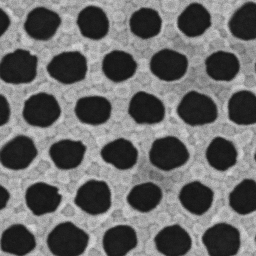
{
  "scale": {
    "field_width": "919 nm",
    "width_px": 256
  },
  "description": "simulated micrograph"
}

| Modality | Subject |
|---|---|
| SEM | a regular array of holes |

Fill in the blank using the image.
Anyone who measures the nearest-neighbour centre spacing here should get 179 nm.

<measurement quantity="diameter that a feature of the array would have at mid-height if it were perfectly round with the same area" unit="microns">0.118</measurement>